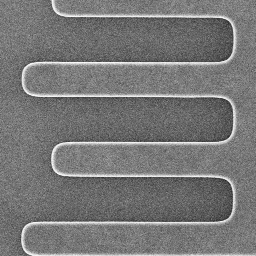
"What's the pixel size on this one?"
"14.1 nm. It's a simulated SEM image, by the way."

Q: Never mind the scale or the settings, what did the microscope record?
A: groups of lines, slits or small figures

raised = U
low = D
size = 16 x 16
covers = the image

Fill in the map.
DDDUUUUUUUUUUUUU
DDDDDDDDDDDDDDUU
DDDDDDDDDDDDDDDU
DDDDDDDDDDDDDDUU
DUUUUUUUUUUUUUUU
DDUUUUUUUUUUUUUU
DDDDDDDDDDDDDDUU
DDDDDDDDDDDDDDDU
DDDDDDDDDDDDDDUU
DDDUUUUUUUUUUUUU
DDDUUUUUUUUUUUUU
DDDDDDDDDDDDDDUU
DDDDDDDDDDDDDDDU
DDDDDDDDDDDDDDUU
DUUUUUUUUUUUUUUU
DDUUUUUUUUUUUUUU